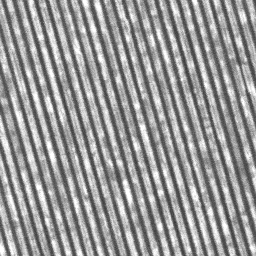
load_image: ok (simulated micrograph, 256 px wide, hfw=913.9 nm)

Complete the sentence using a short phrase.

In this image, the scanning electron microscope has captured parallel lines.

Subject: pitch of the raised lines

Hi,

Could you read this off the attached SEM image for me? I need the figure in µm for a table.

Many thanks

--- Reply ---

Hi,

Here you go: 0.0376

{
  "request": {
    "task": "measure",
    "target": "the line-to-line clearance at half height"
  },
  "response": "17.6 nm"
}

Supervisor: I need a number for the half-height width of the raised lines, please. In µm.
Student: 0.0176